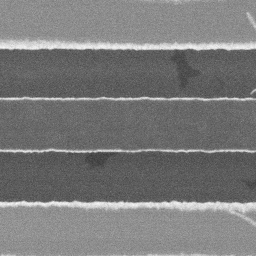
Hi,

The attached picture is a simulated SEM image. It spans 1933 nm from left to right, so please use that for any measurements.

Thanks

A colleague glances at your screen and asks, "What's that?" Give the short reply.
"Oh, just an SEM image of lines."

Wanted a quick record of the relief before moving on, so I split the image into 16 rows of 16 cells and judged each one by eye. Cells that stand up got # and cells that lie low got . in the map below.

################
################
################
................
................
................
################
################
################
................
................
................
................
################
################
################